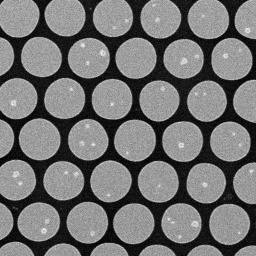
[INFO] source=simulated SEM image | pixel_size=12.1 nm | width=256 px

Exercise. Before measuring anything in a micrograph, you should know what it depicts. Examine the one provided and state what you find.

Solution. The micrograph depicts an array of small figures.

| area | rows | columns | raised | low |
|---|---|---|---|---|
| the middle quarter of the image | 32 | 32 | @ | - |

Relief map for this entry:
-@@@@@@@@@@--@@@@@@@@@@--@@@@@@@
--@@@@@@@@----@@@@@@@@----@@@@@@
---@@@@@@------@@@@@@------@@@@@
------@----------------------@--
@@@------@@@@@@-------@@@-------
@@@@----@@@@@@@@----@@@@@@@-----
@@@@@---@@@@@@@@----@@@@@@@@----
@@@@@--@@@@@@@@@@--@@@@@@@@@---@
@@@@@--@@@@@@@@@@--@@@@@@@@@@--@
@@@@@--@@@@@@@@@@--@@@@@@@@@@--@
@@@@@--@@@@@@@@@@--@@@@@@@@@@--@
@@@@----@@@@@@@@----@@@@@@@@---@
@@@@----@@@@@@@@----@@@@@@@-----
@---------@@@@-------@@@@@------
----@@@@--------@@@@------------
---@@@@@@-----@@@@@@@@----@@@@@@
--@@@@@@@@---@@@@@@@@@---@@@@@@@
-@@@@@@@@@@--@@@@@@@@@@--@@@@@@@
-@@@@@@@@@@--@@@@@@@@@@--@@@@@@@
-@@@@@@@@@@--@@@@@@@@@@--@@@@@@@
-@@@@@@@@@@--@@@@@@@@@@--@@@@@@@
--@@@@@@@@---@@@@@@@@@---@@@@@@@
---@@@@@@@----@@@@@@@@----@@@@@@
----@@@@-------@@@@@@------@@@@@
----------@@@---------@@@-------
@@@-----@@@@@@@-----@@@@@@@-----
@@@@----@@@@@@@@---@@@@@@@@@----
@@@@@--@@@@@@@@@@--@@@@@@@@@---@
@@@@@--@@@@@@@@@@--@@@@@@@@@---@
@@@@@--@@@@@@@@@@--@@@@@@@@@@--@
@@@@@--@@@@@@@@@@--@@@@@@@@@@--@
@@@@---@@@@@@@@@---@@@@@@@@@---@